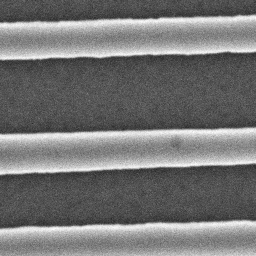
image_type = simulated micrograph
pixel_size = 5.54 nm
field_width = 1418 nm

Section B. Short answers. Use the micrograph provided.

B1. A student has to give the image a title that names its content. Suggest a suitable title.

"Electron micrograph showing lines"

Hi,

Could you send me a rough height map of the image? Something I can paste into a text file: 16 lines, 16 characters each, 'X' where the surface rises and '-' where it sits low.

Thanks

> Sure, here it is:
----------------
XXXXXXXXXXXXXXXX
XXXXXXXXXXXXXXXX
XXXXXXX---------
----------------
----------------
----------------
----------------
XXXXXXXXXXXXXXXX
XXXXXXXXXXXXXXXX
XXXXXXXXX-------
----------------
----------------
----------------
XXXXXXXXXXXXXXXX
XXXXXXXXXXXXXXXX